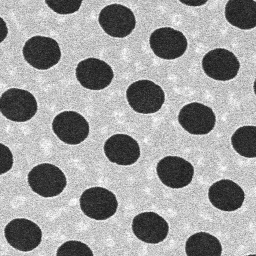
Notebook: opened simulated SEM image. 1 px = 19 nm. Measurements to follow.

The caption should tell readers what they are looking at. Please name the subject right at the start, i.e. a regular array of holes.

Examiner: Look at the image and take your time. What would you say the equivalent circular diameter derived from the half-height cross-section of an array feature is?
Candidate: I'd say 675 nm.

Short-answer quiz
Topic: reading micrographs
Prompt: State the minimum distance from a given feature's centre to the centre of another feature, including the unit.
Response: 1080 nm